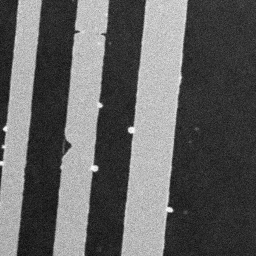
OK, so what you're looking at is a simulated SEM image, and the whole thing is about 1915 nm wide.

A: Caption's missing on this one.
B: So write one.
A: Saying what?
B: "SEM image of one or a few lines or trenches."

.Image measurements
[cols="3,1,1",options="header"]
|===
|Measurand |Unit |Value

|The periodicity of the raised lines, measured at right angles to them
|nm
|519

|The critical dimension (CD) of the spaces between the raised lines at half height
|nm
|275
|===